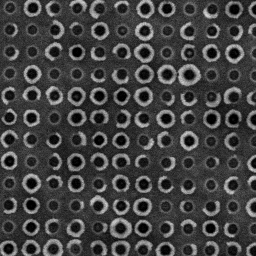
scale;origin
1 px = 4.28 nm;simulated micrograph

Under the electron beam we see a regular array of holes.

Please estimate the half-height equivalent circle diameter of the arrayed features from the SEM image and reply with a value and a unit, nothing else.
44 nm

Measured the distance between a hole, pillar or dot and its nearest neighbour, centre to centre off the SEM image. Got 93.3 nm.